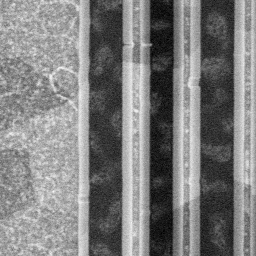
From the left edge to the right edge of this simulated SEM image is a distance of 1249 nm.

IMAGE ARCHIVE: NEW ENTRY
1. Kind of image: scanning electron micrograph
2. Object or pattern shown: parallel lines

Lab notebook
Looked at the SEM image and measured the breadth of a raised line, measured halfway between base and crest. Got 80 nm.